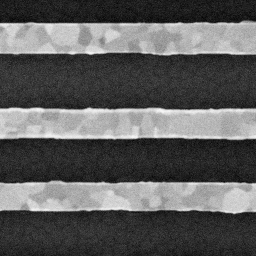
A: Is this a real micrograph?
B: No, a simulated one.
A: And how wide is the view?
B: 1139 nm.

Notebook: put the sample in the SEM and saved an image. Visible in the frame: lines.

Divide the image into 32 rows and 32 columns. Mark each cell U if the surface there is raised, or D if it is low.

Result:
DDDDDDDDDDDDDDDDDDDDDDDDDDDDDDDD
DDDDDDDDDDDDDDDDDDDDDDDDDDDDDDDD
DDDDDDDDDDDDDDDDDDDDDDDDDDDDDDDD
UUUUUUUUUUUUUUUUUUUUUUUUUUUUUUUU
UUUUUUUUUUUUUUUUUUUUUUUUUUUUUUUU
UUUUUUUUUUUUUUUUUUUUUUUUUUUUUUUU
UUUUUUUUUUUUUUUUUUUUUUUUUUUUUUUU
DDDDDDDDDDDDDDDDDDDDDDDDDDDDDDDD
DDDDDDDDDDDDDDDDDDDDDDDDDDDDDDDD
DDDDDDDDDDDDDDDDDDDDDDDDDDDDDDDD
DDDDDDDDDDDDDDDDDDDDDDDDDDDDDDDD
DDDDDDDDDDDDDDDDDDDDDDDDDDDDDDDD
DDDDDDDDDDDDDDDDDDDDDDDDDDDDDDDD
DDDDDDDDDDDDDDDDDDDDDDDDDDDDDDDD
UUUUUUUUUUUUUUUUUUUUUUUUUUUUUUUU
UUUUUUUUUUUUUUUUUUUUUUUUUUUUUUUU
UUUUUUUUUUUUUUUUUUUUUUUUUUUUUUUU
DDDDDDDDDDDDDDDDDDDDDDDDDDDDDDDD
DDDDDDDDDDDDDDDDDDDDDDDDDDDDDDDD
DDDDDDDDDDDDDDDDDDDDDDDDDDDDDDDD
DDDDDDDDDDDDDDDDDDDDDDDDDDDDDDDD
DDDDDDDDDDDDDDDDDDDDDDDDDDDDDDDD
DDDDDDDDDDDDDDDDDDDDDDDDDDDDDDDD
UUUUUUUUUUUUUUUUUUUUUUUUUUUUUUUU
UUUUUUUUUUUUUUUUUUUUUUUUUUUUUUUU
UUUUUUUUUUUUUUUUUUUUUUUUUUUUUUUU
DDDDDDDDDDDDDDDDDDDDDDDDDDDDUUUD
DDDDDDDDDDDDDDDDDDDDDDDDDDDDDDDD
DDDDDDDDDDDDDDDDDDDDDDDDDDDDDDDD
DDDDDDDDDDDDDDDDDDDDDDDDDDDDDDDD
DDDDDDDDDDDDDDDDDDDDDDDDDDDDDDDD
DDDDDDDDDDDDDDDDDDDDDDDDDDDDDDDD